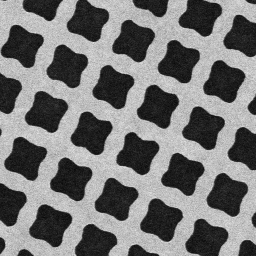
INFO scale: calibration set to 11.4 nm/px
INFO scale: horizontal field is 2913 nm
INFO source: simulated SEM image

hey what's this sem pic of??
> a regular array of holes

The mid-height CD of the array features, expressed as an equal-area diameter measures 436 nm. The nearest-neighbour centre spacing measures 562 nm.